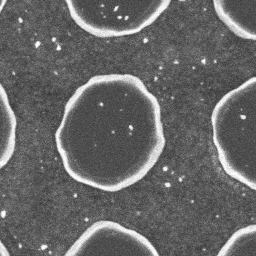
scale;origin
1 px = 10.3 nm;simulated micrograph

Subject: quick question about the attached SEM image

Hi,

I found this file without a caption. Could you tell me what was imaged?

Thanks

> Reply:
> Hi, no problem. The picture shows raised bodies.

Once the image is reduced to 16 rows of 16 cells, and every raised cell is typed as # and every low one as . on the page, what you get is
....######....##
.....####......#
................
................
................
.....####......#
#...######....##
#...######...###
#...######...###
#...######....##
....#####.....##
......##........
................
................
......##.......#
.....####.....##